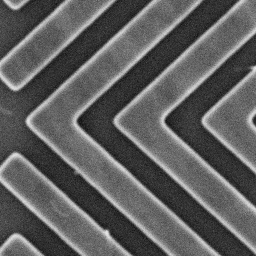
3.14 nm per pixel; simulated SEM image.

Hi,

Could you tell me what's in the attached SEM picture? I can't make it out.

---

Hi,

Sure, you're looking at groups of lines, slits or small figures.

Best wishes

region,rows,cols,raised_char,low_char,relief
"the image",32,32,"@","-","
-@@-----@@@@@@-----@@@@@@-----@@
-------@@@@@@-----@@@@@@-----@@@
------@@@@@@-----@@@@@@----@@@@@
-----@@@@@@-----@@@@@@----@@@@@@
----@@@@@@----@@@@@@@----@@@@@@-
--@@@@@@@----@@@@@@-----@@@@@@--
-@@@@@@-----@@@@@@-----@@@@@@---
@@@@@@-----@@@@@@-----@@@@@@----
@@@@@-----@@@@@@-----@@@@@@-----
@@@@-----@@@@@@-----@@@@@@-----@
-@@-----@@@@@@-----@@@@@@-----@@
-------@@@@@@-----@@@@@@-----@@@
------@@@@@@-----@@@@@@-----@@@@
-----@@@@@@-----@@@@@@-----@@@@@
----@@@@@@-----@@@@@@-----@@@@@@
---@@@@@@@----@@@@@@@----@@@@@@@
----@@@@@@-----@@@@@@@----@@@@@@
-----@@@@@@@----@@@@@@@----@@@@@
------@@@@@@@-----@@@@@@-----@@@
-@@-----@@@@@@-----@@@@@@-----@@
@@@@-----@@@@@@-----@@@@@@-----@
@@@@@-----@@@@@@-----@@@@@@-----
@@@@@@-----@@@@@@-----@@@@@@----
-@@@@@@-----@@@@@@-----@@@@@@---
--@@@@@@-----@@@@@@-----@@@@@@--
---@@@@@@-----@@@@@@-----@@@@@@-
----@@@@@@-----@@@@@@-----@@@@@@
-----@@@@@@@----@@@@@@@----@@@@@
------@@@@@@@----@@@@@@@----@@@@
--@-----@@@@@@-----@@@@@@-----@@
-@@@-----@@@@@@-----@@@@@@-----@
@@@@@-----@@@@@@-----@@@@@@-----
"